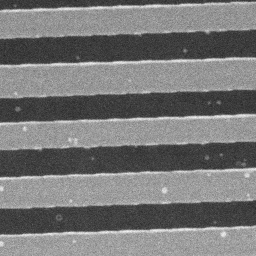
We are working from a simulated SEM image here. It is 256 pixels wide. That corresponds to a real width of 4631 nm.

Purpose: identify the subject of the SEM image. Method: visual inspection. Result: lines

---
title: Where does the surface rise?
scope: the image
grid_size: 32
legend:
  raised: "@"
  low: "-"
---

-------------------------@@@@@@@
@@@@@@@@@@@@@@@@@@@@@@@@@@@@@@@@
@@@@@@@@@@@@@@@@@@@@@@@@@@@@@@@@
@@@@@@@@@@@@@@@@@@@@@@@@@@@@@@@@
@@@@@@@@------------------------
--------------------------------
--------------------------------
--------------------------@@@@@@
@@@@@@@@@@@@@@@@@@@@@@@@@@@@@@@@
@@@@@@@@@@@@@@@@@@@@@@@@@@@@@@@@
@@@@@@@@@@@@@@@@@@@@@@@@@@@@@@@@
@@@@@@@@@@@@@@@@@@@-------------
--------------------------------
--------------------------------
---------------------------@@@@@
@@@@@@@@@@@@@@@@@@@@@@@@@@@@@@@@
@@@@@@@@@@@@@@@@@@@@@@@@@@@@@@@@
@@@@@@@@@@@@@@@@@@@@@@@@@@@@@@@@
@@@@@---------------------------
--------------------------------
--------------------------------
---------------------@@@@@@@@@@@
@@@@@@@@@@@@@@@@@@@@@@@@@@@@@@@@
@@@@@@@@@@@@@@@@@@@@@@@@@@@@@@@@
@@@@@@@@@@@@@@@@@@@@@@@@@@@@@@@@
@@@@@@@@@@@@@@------------------
--------------------------------
--------------------------------
-----------------------------@@@
@@@@@@@@@@@@@@@@@@@@@@@@@@@@@@@@
@@@@@@@@@@@@@@@@@@@@@@@@@@@@@@@@
@@@@@@@@@@@@@@@@@@@@@@@@@@@@@@@@